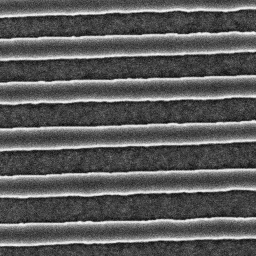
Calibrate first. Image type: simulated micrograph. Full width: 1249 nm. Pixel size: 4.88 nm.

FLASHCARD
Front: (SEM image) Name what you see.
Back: lines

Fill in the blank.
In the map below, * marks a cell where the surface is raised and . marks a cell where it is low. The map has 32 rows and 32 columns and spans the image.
********************************
**************.*................
................................
................................
.............*******************
********************************
*****************************...
*...............................
................................
................................
********************************
********************************
******************..............
................................
................................
.....................***********
********************************
********************************
********........................
................................
................................
...................*************
********************************
********************************
******..........................
................................
................................
........................********
********************************
********************************
*******.........................
................................